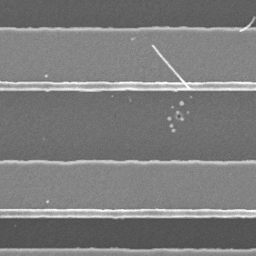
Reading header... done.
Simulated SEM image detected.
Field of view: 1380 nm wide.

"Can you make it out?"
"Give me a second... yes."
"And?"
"lines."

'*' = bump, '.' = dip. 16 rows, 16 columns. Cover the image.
................
................
****************
****************
****************
****************
................
................
................
................
****************
****************
****************
****************
................
................